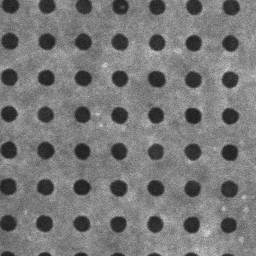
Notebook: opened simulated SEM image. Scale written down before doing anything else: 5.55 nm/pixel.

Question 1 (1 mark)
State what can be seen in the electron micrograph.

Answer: a regular array of holes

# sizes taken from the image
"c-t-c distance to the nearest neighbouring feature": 200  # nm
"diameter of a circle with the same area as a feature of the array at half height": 97.6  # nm